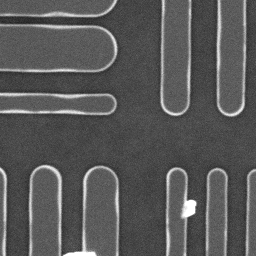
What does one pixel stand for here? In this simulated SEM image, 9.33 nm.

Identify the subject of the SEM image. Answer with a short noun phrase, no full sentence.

groups of lines, slits or small figures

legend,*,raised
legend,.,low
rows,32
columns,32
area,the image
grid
**************......****...****.
*************.......****...****.
....................****...****.
*************.......****...****.
**************......****...****.
**************......****...****.
**************......****...****.
**************......****...****.
*************.......****...****.
....................****...***..
....................****...***..
....................****...***..
**************......****...***..
**************.......**....***..
................................
................................
................................
................................
................................
................................
................................
....***....***.......**...**...*
*...***....****......**...**...*
*...***....****......**...**...*
*...***....****......**...**...*
*...***....****......***..**...*
*...****..*****......***..**...*
*...****..*****......**...**...*
*...***...*****......**...**...*
*...***...*****......**...**...*
*...****..*****......**...**...*
....****..*****......**...**...*